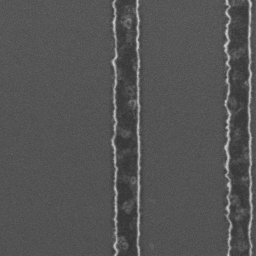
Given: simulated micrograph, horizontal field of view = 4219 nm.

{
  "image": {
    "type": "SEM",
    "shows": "one or a few lines or trenches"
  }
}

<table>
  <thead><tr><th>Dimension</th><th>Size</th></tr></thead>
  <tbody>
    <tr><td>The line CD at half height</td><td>0.383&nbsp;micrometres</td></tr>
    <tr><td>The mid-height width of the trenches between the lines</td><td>1480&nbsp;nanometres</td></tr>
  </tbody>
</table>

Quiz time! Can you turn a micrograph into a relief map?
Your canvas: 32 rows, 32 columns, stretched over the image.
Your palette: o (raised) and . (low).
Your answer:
..............ooo...........ooo.
..............ooo...........ooo.
..............ooo............oo.
..............ooo...........ooo.
..............ooo...........ooo.
..............ooo...........ooo.
..............ooo...........ooo.
..............ooo...........ooo.
..............ooo............oo.
..............ooo...........ooo.
..............ooo...........ooo.
..............ooo............oo.
..............ooo...........ooo.
..............ooo...........ooo.
..............ooo............oo.
..............ooo............oo.
..............ooo............oo.
..............ooo............oo.
..............ooo...........ooo.
..............ooo...........ooo.
..............ooo...........ooo.
..............ooo...........ooo.
..............ooo............oo.
..............ooo............oo.
..............ooo............oo.
..............ooo............oo.
..............ooo...........ooo.
..............ooo............oo.
..............ooo............oo.
..............ooo............oo.
..............ooo............oo.
..............ooo............oo.